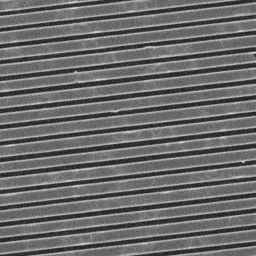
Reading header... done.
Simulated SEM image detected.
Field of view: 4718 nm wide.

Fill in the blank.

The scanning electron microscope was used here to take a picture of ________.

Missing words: parallel lines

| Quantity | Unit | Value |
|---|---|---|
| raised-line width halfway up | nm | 206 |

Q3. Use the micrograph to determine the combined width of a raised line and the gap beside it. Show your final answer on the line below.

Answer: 297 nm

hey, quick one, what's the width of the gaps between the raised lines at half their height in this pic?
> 96.1 nanometers